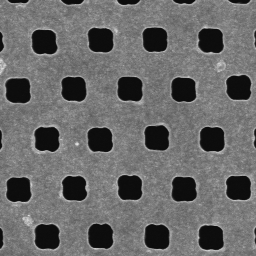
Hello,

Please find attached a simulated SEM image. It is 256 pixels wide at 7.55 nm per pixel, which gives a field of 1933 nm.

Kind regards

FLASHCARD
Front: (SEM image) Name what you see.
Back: a regular array of holes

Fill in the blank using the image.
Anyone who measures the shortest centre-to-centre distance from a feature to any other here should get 410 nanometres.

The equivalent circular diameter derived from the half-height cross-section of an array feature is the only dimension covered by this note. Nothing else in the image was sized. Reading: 198 nm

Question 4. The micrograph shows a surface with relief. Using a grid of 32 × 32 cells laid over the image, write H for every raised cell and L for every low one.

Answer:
HHHHHHHHHHHHHHHLLHHHHHHHHHHHHHHH
HHHHHHHHHHHHHHHHHHHHHHHHHHHHHHHH
HHHHHHHHHHHHHHHHHHHHHHHHHHHHHHHH
HHHHHHHHHHHHHHHHHHHLHHHHHHHHHHHH
HHHHLLLHHHHLLLHHHHLLLHHHHLLLHHHH
HHHHLLLHHHHLLLHHHHLLLHHHHLLLHHHH
HHHHLLLHHHHHHHHHHHHHHHHHHHLHHHHH
HHHHHHHHHHHHHHHHHHHHHHHHHHHHHHHH
HHHHHHHHHHHHHHHHHHHHHHHHHHHHHHHH
HHHHHHHHHHHHHHHHHHHHHHHHHHHHHLLH
HLLLHHHHLLLHHHHLLLHHHLLLHHHHLLLH
HLLLHHHHLLLHHHHLLLHHHLLLHHHHLLLH
HLLLHHHHLLHHHHHLLHHHHHLLHHHHHLHH
HHHHHHHHHHHHHHHHHHHHHHHHHHHHHHHH
HHHHHHHHHHHHHHHHHHHHHHHHHHHHHHHH
HHHHHHHHHHHHHHHHHHHHHHHHHHHHHHHH
HHHHLLLHHHHLLLHHHHLLLHHHHLLLHHHH
HHHHLLLHHHHLLLHHHHLLLHHHHLLLHHHH
HHHHHLLHHHHLLLHHHHLLLHHHHLLLHHHH
HHHHHHHHHHHHHHHHHHHHHHHHHHHHHHHH
HHHHHHHHHHHHHHHHHHHHHHHHHHHHHHHH
HHHHHHHHHHHHHHHHHHHHHHHHHHHHHHHH
HLLLHHHHLLLHHHHLLLHHHHLLHHHHLLLH
HLLLHHHHLLLHHHHLLLHHHHLLHHHHLLLH
HLLLHHHHLLLHHHHLLLHHHHLLHHHHLLLH
HHHHHHHHHHHHHHHHHHHHHHHHHHHHHHHH
HHHHHHHHHHHHHHHHHHHHHHHHHHHHHHHH
HHHHHHHHHHHHHHHHHHHHHHHHHHHHHHHH
HHHHHLLHHHHLLLHHHHLLLHHHHLLHHHHH
HHHHLLLHHHHLLLHHHHLLLHHHHLLLHHHH
HHHHLLLHHHHLLLHHHHLLLHHHHLLLHHHH
HHHHHHHHHHHHHHHHHHHHHHHHHHHHHHHH